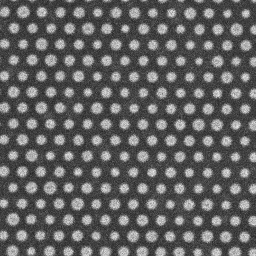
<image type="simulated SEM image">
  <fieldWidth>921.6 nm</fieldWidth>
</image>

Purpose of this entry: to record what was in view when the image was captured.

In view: a regular array of raised bodies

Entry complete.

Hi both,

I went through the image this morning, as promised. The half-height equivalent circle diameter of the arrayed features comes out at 34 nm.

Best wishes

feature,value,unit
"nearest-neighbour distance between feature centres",65.5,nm